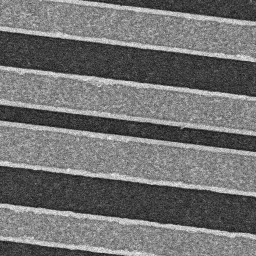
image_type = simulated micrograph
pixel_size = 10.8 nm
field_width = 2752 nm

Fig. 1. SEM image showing one or a few lines or trenches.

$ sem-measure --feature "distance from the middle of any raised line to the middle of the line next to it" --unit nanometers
726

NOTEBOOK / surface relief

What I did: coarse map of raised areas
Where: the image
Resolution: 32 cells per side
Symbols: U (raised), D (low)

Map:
UUUUUUUUUUUUDDDDDDDDDDDDDDDDDDDD
UUUUUUUUUUUUUUUUUUUUDDDDDDDDDDDD
UUUUUUUUUUUUUUUUUUUUUUUUUUUUDDDD
UUUUUUUUUUUUUUUUUUUUUUUUUUUUUUUU
DDDDDDDDUUUUUUUUUUUUUUUUUUUUUUUU
DDDDDDDDDDDDDDDUUUUUUUUUUUUUUUUU
DDDDDDDDDDDDDDDDDDDDDDDDUUUUUUUU
DDDDDDDDDDDDDDDDDDDDDDDDDDDDDDDD
DDDDDDDDDDDDDDDDDDDDDDDDDDDDDDDD
UUUUUUUUDDDDDDDDDDDDDDDDDDDDDDDD
UUUUUUUUUUUUUUUUUDDDDDDDDDDDDDDD
UUUUUUUUUUUUUUUUUUUUUUUUUDDDDDDD
UUUUUUUUUUUUUUUUUUUUUUUUUUUUUUUU
DDDDDDUUUUUUUUUUUUUUUUUUUUUUUUUU
DDDDDDDDDDDDDDUUUUUUUUUUUUUUUUUU
UDDDDDDDDDDDDDDDDDDDDDUUUUUUUUUU
UUUUUUUUUDDDDDDDDDDDDDDDDDDDDDUU
UUUUUUUUUUUUUUUUUDDDDDDDDDDDDDDD
UUUUUUUUUUUUUUUUUUUUUUUUUDDDDDDD
UUUUUUUUUUUUUUUUUUUUUUUUUUUUUUUU
UUUUUUUUUUUUUUUUUUUUUUUUUUUUUUUU
DDDDDDDDDUUUUUUUUUUUUUUUUUUUUUUU
DDDDDDDDDDDDDDDDDUUUUUUUUUUUUUUU
DDDDDDDDDDDDDDDDDDDDDDDDDUUUUUUU
DDDDDDDDDDDDDDDDDDDDDDDDDDDDDDDD
DDDDDDDDDDDDDDDDDDDDDDDDDDDDDDDD
UUUUUUDDDDDDDDDDDDDDDDDDDDDDDDDD
UUUUUUUUUUUUUUUDDDDDDDDDDDDDDDDD
UUUUUUUUUUUUUUUUUUUUUUUDDDDDDDDD
UUUUUUUUUUUUUUUUUUUUUUUUUUUUUUUD
DDDDDUUUUUUUUUUUUUUUUUUUUUUUUUUU
DDDDDDDDDDDDDDUUUUUUUUUUUUUUUUUU